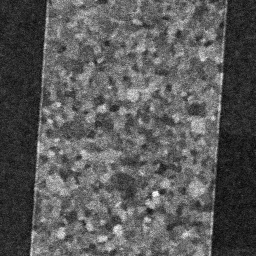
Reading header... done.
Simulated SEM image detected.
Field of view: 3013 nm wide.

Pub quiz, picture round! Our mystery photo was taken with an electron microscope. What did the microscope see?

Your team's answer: one or a few lines or trenches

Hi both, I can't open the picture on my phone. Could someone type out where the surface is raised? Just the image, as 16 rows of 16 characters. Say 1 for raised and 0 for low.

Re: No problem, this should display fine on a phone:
0001111111111100
0001111111111100
0001111111111100
0001111111111100
0001111111111100
0001111111111100
0001111111111100
0001111111111100
0011111111111100
0011111111111100
0011111111111000
0011111111111000
0011111111111000
0011111111111000
0011111111111000
0011111111111000